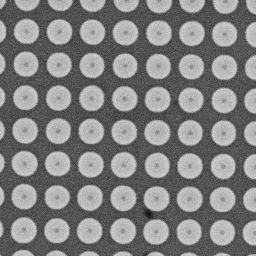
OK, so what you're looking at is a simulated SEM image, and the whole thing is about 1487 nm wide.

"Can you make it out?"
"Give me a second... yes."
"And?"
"an array of small figures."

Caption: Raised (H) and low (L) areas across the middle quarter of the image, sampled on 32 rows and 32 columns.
HHLLHHHHHHLLHHHHHHLLLHHHHHHLLHHH
HHLLHHHHHHLLHHHHHHLLLHHHHHHLLHHH
HLLLLHHHHLLLLHHHHHLLLHHHHHLLLHHH
LLLLLLLLLLLLLLLLLLLLLLLHHLLLLLLH
LLLLLLLLLLLLLLLLLLLLLLLLLLLLLLLL
LLLLLLHHLLLLLLLLLLLLLLLLLLLLLLLL
HLLLLHHHHLLLLHHHHLLLLHHHHHLLLLHH
HHLLHHHHHHLLHHHHHHLLLHHHHHLLLHHH
HHLLHHHHHHLLHHHHHHLLHHHHHHHLLHHH
HHLLHHHHHHLLHHHHHHLLHHHHHHHLLHHH
HLLLLHHHHLLLLHHHHHLLLHHHHHLLLHHH
LLLLLLHHLLLLLLHHLLLLLLHHHLLLLLHH
LLLLLLLLLLLLLLLLLLLLLLLLLLLLLLLL
LLLLLLLLLLLLLLLLLLLLLLLLLLLLLLLL
HLLLLHHHHLLLLHHHHLLLLLHHHLLLLLHH
HLLLHHHHHHLLHHHHHHLLLHHHHHLLLHHH
HHLLHHHHHHLLHHHHHHLLHHHHHHLLLHHH
HHLLHHHHHHLLHHHHHHLLHHHHHHLLLHHH
HLLLHHHHHLLLHHHHHHLLLHHHHHLLLHHH
LLLLLHHHLLLLLHHHHLLLLHHHHHLLLHHH
LLLLLLLLLLLLLLLLLLLLLLLLLLLLLLLL
LLLLLLLLLLLLLLLLLLLLLLLLLLLLLLLL
LLLLLHHHLLLLLHHHLLLLLLHHLLLLLLLH
HLLLHHHHHLLLHHHHHLLLLHHHHHLLLHHH
HLLLHHHHHHLLHHHHHHLLHHHHHHLLLHHH
HLLLHHHHHHLLHHHHHHLLHHHHHHLLLHHH
HLLLHHHHHHLLHHHHHHLLHHHHHHLLLHHH
LLLLLHHHHLLLLHHHHLLLLHHHHHLLLHHH
LLLLLLLLLLLLLLLLLLLLLLLLLLLLLLHH
LLLLLLLLLLLLLLLLLLLLLLLLLLLLLLLL
LLLLLHHHLLLLLLHLLLLLLLLLLLLLLLLL
HLLLHHHHHLLLHHHHHLLLLHHHHLLLLHHH